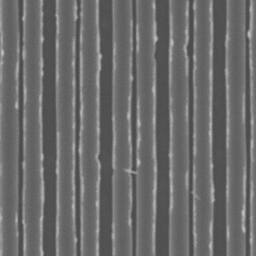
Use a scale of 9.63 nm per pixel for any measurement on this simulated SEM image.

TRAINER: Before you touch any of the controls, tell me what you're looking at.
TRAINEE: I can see parallel lines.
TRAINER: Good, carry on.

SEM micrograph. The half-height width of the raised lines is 0.182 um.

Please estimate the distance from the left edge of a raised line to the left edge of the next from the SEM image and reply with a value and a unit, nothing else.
29 px